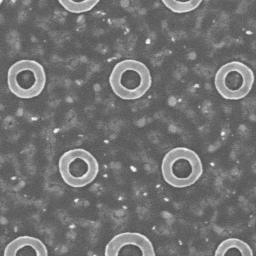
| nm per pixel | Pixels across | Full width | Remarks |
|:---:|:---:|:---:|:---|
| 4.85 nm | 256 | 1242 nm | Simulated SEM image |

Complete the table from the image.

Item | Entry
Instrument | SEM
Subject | ring-shaped raised bodies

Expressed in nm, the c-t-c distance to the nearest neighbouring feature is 493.